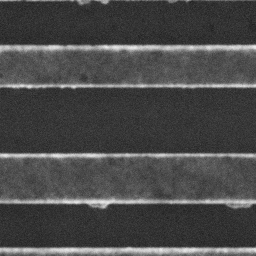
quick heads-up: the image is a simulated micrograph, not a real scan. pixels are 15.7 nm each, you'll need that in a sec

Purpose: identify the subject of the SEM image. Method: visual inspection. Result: lines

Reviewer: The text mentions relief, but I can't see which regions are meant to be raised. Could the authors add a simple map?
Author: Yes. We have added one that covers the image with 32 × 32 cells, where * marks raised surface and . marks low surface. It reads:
................................
................................
................................
................................
................................
................................
********************************
********************************
********************************
********************************
********************************
................................
................................
................................
................................
................................
................................
................................
................................
********************************
********************************
********************************
********************************
********************************
********************************
................................
................................
................................
................................
................................
................................
********************************